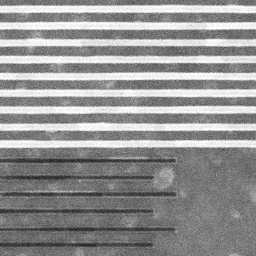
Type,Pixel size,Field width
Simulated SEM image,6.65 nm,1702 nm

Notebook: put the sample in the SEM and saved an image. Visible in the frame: parallel lines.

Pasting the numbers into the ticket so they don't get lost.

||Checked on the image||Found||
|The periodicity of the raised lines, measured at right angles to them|112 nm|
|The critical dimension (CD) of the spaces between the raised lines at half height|74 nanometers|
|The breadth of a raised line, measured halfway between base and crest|34.9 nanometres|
